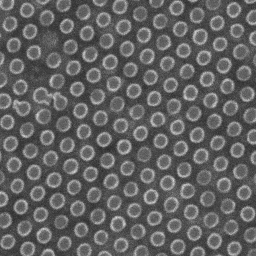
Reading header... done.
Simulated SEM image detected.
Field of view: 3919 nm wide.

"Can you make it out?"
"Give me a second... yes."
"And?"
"a regular array of raised bodies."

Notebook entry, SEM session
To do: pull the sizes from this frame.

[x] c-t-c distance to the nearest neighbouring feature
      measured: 324 nanometres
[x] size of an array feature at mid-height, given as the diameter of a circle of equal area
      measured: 14 px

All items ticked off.